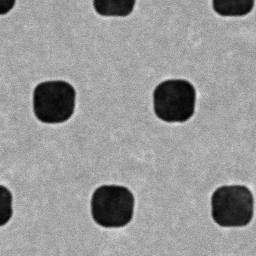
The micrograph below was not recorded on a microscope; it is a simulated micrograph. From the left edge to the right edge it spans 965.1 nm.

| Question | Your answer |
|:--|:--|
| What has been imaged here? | holes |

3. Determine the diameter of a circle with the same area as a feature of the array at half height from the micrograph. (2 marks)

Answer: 170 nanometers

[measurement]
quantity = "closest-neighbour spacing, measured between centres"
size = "452 nm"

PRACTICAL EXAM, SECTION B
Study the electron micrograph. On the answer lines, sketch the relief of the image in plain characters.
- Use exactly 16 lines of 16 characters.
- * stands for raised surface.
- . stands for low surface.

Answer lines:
.*****..*****...
****************
****************
****************
****************
**...*****..****
**...*****..****
***.******..****
****************
****************
****************
****************
.*****..*****...
.*****..*****...
****************
****************